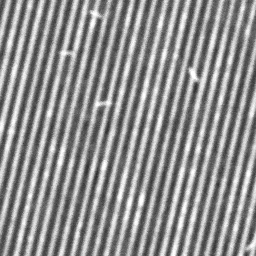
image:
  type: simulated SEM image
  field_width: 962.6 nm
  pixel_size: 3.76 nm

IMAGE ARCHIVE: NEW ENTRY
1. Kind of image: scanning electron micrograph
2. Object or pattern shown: parallel lines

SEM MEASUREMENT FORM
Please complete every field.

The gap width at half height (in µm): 0.0289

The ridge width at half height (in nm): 11.9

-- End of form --